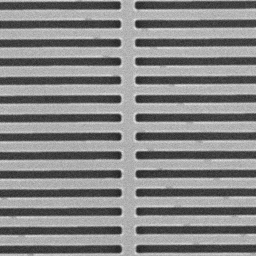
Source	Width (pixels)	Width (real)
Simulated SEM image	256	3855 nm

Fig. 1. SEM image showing groups of lines, slits or small figures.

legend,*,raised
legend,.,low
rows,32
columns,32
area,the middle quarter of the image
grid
..............****..............
********************************
********************************
..............****..............
..............****..............
********************************
********************************
********************************
..............****..............
..............****..............
********************************
********************************
..............****..............
...............***..............
..............****..............
********************************
********************************
..............****..............
...............***..............
********************************
********************************
********************************
...............***..............
..............****..............
********************************
********************************
..............****..............
...............***..............
..............****..............
********************************
********************************
..............****..............